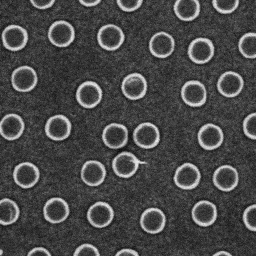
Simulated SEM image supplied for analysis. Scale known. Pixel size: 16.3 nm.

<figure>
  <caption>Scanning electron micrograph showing a regular array of raised bodies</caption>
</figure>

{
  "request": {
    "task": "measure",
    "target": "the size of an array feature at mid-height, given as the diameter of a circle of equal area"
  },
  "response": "0.393 um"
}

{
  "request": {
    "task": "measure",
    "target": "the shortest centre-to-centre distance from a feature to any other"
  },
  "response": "682 nm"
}